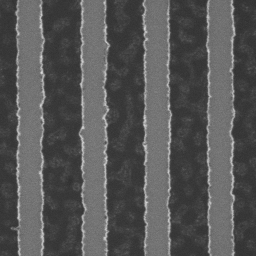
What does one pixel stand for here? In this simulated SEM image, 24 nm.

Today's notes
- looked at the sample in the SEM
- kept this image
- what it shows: one or a few lines or trenches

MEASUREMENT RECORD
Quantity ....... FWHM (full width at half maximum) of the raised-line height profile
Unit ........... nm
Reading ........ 968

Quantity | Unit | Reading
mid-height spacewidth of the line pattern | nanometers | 552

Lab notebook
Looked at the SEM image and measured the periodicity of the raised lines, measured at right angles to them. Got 1520 nm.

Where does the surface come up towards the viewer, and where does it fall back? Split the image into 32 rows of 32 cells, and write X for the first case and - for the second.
XX---XXXXX---XXXXX---XXXXX---XXX
XX---XXXXX---XXXXX---XXXXX---XXX
XX---XXXXX---XXXXX---XXXXX---XXX
XX---XXXXX---XXXXX---XXXXX---XXX
XX---XXXXX---XXXXX---XXXXX---XXX
XX---XXXXX---XXXXX---XXXXX---XXX
XX---XXXXX---XXXXX---XXXXX---XXX
XX---XXXXX---XXXXX---XXXXX---XXX
XX---XXXXX---XXXXX---XXXXX---XXX
XX---XXXXX---XXXXX---XXXXX---XXX
XX---XXXXX---XXXXX---XXXXX---XXX
XX---XXXXX---XXXXX---XXXXX---XXX
XX---XXXXX---XXXXX---XXXXX---XXX
XX---XXXXX---XXXXX---XXXXX---XXX
XX---XXXXX---XXXXX---XXXXX---XXX
XX---XXXXX---XXXXX---XXXXX---XXX
XX---XXXXX---XXXXX---XXXXX---XXX
XX---XXXXX---XXXXX---XXXXX---XXX
XX---XXXXX---XXXXX---XXXXX---XXX
XX---XXXXX---XXXXX---XXXXX---XXX
XX---XXXXX---XXXXX---XXXXX---XXX
XX---XXXXX---XX-XX---XXXXX---XXX
XX---XXXXX---XXXXX---XXXXX---XXX
XX---XXXXX---XXXXX---XXXXX---XXX
XX---XXXXX---XXXXX---XXXXX---XXX
XX---XXXXX---XXXXX---XXXXX---XXX
XX---XXXXXX--XXXXX---XXXXX---XXX
XX---XXXXX---XXXXX---XXXXX---XXX
XX---XXXXX---XXXXX---XXXXX---XXX
XX---XXXXX---XXXXX---XXXXX---XXX
XX---XXXXX---XXXXX---XXXXX---XXX
XX---XXXXX---XXXXX---XXXXX---XXX